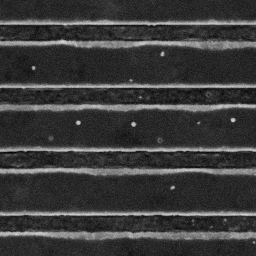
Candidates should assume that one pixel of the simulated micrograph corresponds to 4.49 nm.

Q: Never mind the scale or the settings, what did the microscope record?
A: lines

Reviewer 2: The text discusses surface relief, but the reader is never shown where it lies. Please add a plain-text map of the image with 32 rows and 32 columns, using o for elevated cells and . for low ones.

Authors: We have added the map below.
oooooooooooooooooooooooooooooooo
oooooooooooooooooooooooooooooooo
oooooooooooooooooooooooooooooooo
................................
................................
ooooooooooooooooooooooooo.o.oooo
oooooooooooooooooooooooooooooooo
oooooooooooooooooooooooooooooooo
oooooooooooooooooooooooooooooooo
oooooooooooooooooooooooooooooooo
oooooooooooooooooooooooooooooooo
................................
................................
oooooooooooooooooooooooooooooooo
oooooooooooooooooooooooooooooooo
oooooooooooooooooooooooooooooooo
oooooooooooooooooooooooooooooooo
oooooooooooooooooooooooooooooooo
oooooooooooooooooooooooooooooooo
................................
................................
oooooooooooooooooooooooooooooooo
oooooooooooooooooooooooooooooooo
oooooooooooooooooooooooooooooooo
oooooooooooooooooooooooooooooooo
oooooooooooooooooooooooooooooooo
oooooooooooooooooooooooooooooooo
................................
................................
oooooooooooooooooooooooooooooooo
oooooooooooooooooooooooooooooooo
oooooooooooooooooooooooooooooooo